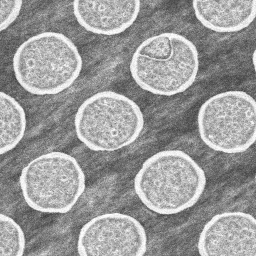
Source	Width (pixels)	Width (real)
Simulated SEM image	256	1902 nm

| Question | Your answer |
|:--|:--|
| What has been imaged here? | raised bodies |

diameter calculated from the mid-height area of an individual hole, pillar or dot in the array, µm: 0.45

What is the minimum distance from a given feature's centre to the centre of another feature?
0.611 microns